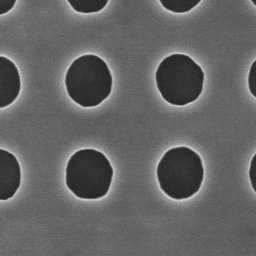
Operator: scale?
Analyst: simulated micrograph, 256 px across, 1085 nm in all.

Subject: holes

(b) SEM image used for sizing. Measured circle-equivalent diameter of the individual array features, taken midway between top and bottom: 209 nm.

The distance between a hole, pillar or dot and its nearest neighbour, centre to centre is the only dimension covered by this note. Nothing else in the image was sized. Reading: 0.386 micrometres